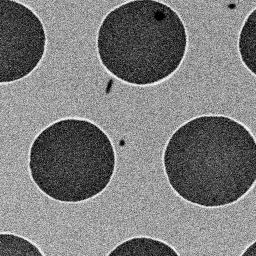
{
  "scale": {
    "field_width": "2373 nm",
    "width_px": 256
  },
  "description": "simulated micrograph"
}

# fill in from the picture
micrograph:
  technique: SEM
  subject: holes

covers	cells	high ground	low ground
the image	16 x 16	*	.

..*****....*****
...***.....****.
...***......***.
...***.....****.
..*****....*****
****************
****************
****.*******..**
**.....****.....
**.....***......
**.....***......
**.....****.....
****.*******...*
****************
****************
..*****....****.